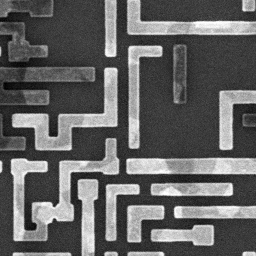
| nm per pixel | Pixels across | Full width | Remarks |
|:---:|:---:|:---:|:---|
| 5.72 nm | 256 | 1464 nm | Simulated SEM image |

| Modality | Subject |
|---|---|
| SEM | wiring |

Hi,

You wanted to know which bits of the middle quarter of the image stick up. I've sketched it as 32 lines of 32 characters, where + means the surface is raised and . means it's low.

................++..........++..
+++++++...+++...++..........++..
+++++++...+++...++..........++..
+++++++...+++...++..........++..
..........+++...++..........++..
..........+++...++..........++..
..........+++...++..........++..
..........+++...++..........++..
..........+++...++..........++..
..........+++...++..........++..
..........+++...++..............
..........+++...++..............
..........+++...++..............
+++++++++++++...++..............
+++++++++++++...++..............
++..............++..............
++..............++..............
++..............+++.............
++..............+++.............
++.........++...+++.............
++.........++...+++.............
...........++...................
...........++...................
..........+++...................
++++++++++++++..++++++++++++++++
++++++++++++++..++++++++++++++++
++++++++++++++..++++++++++++++++
++..............................
+...............................
+...++++........................
+...++++...+++++++....++++++++++
+...++++...++++++++...++++++++++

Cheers